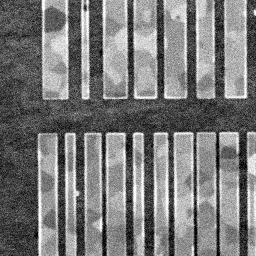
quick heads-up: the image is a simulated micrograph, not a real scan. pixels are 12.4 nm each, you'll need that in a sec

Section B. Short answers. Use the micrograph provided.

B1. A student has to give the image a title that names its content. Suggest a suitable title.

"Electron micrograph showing groups of lines, slits or small figures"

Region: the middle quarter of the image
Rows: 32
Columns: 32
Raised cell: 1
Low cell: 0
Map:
10000100001111110011111001111100
10000100001111110011111001111110
10000100001111110011111001111110
10000100001111110011111001111110
10000100001111110011111001111110
10000100001111110011111001111110
10000100001111110011111001111110
10000100001111110011111001111110
10000100001111000000000000000000
00000000000000000000000000000000
00000000000000000000000000000000
00000000000000000000000000000000
00000000000000000000000000000000
00000000000000000000000000000000
00000000000000000000000000000000
00000000000000000000000000000000
00000000000000000000000000000000
00000001100111100011000111001111
01100111100111100111000111001111
01100111100111100111000111001111
01100111100111100111000111001111
01100111100111100111000111001111
01100111100111100111000111001111
01100111100111100111000111001111
01100111100111100011000111001111
01100111100111100011000111001111
01100111100111100011000111001111
01100111100111100011000111001111
01100111100111100011000111001111
01100111100111100011000111001111
01100111100111100011000111001111
01100111100111100011000111001111